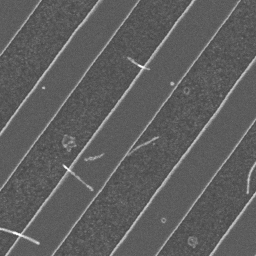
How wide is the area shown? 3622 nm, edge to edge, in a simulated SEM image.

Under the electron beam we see lines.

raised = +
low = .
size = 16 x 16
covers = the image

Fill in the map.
++....++....+++.
++...+++...+++..
+...+++...+++...
....++...+++....
...++....+++...+
..+++...+++....+
.+++...+++....++
.++....+++...+++
+++...+++...+++.
++...+++....+++.
+...+++....+++..
....+++...+++...
...+++...+++....
..+++....+++...+
.+++....+++...++
.+++...+++...+++